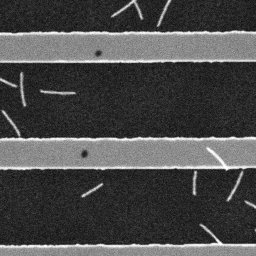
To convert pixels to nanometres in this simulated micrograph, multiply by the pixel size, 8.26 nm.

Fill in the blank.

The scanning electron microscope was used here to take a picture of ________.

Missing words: lines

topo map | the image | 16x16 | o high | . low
................
................
oooooooooooooooo
oooooooooooooooo
................
................
................
................
................
oooooooooooooooo
oooooooooooooooo
................
................
................
................
oooooooooooooooo